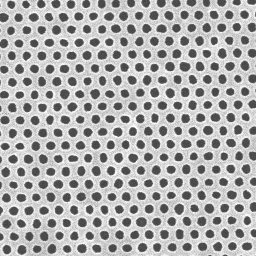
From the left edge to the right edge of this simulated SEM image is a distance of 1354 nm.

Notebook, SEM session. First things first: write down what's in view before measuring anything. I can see a regular array of holes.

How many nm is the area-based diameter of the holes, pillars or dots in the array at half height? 47.7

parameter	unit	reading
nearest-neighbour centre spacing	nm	76.9